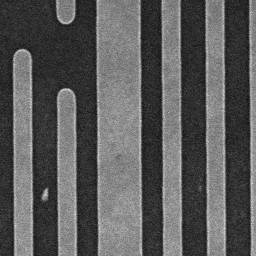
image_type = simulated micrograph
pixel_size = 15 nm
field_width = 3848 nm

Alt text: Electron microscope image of groups of lines, slits or small figures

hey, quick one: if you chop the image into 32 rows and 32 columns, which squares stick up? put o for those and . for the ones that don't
.......oo...ooooo...oo....oo...o
.......oo...ooooo...oo....oo...o
.......oo...ooooo...oo....oo...o
............ooooo...oo....oo...o
............ooooo...oo....oo...o
............ooooo...oo....oo...o
..o.........ooooo...oo....oo...o
..oo........oooooo..oo....oo...o
..oo........oooooo..oo....oo...o
..oo........oooooo..oo....oo...o
..oo........oooooo..oo....oo...o
..oo....o...oooooo..oo....oo...o
..oo...oo...oooooo..ooo...oo...o
..oo...oo...oooooo..ooo...oo...o
..oo...oo...oooooo..oo....oo...o
..oo...oo...oooooo..oo....oo...o
..oo...oo...oooooo..ooo...oo...o
..oo...oo...oooooo..ooo...oo...o
..oo...oo...oooooo..ooo...oo...o
..oo...oo...oooooo..ooo...oo...o
..oo...oo...oooooo..ooo...oo...o
..oo...oo...oooooo..ooo...oo...o
..oo...oo...oooooo..ooo...oo...o
..oo...oo...oooooo..ooo...oo...o
..oo...oo...oooooo..ooo...oo...o
..oo...oo...oooooo..ooo...oo...o
..oo...oo...oooooo..ooo...oo...o
..oo...oo...oooooo...oo...oo...o
..oo...oo...oooooo..ooo...oo...o
..oo...oo...oooooo..ooo...oo....
..oo...oo...oooooo..ooo...oo....
..oo...oo...oooooo...oo...oo...o